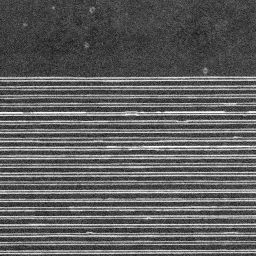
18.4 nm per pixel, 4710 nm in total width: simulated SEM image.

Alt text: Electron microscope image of parallel lines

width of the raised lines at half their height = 50.6 nanometres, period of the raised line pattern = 8.64 pixels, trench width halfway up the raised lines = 5.62 pixels